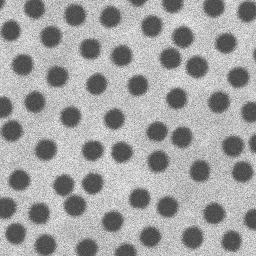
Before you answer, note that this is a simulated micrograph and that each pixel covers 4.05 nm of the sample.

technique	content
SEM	a regular array of holes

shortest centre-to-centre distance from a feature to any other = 132 nm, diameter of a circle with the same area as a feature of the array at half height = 87.3 nm